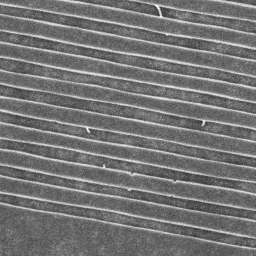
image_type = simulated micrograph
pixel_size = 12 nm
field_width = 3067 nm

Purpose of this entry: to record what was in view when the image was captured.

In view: parallel lines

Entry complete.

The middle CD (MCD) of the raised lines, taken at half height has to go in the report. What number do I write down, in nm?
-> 189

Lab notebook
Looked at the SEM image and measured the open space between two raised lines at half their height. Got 136 nm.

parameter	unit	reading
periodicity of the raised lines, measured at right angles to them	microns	0.318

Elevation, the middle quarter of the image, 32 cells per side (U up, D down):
UUUUUUUUUUUUUUUUDDDDDDDDDDDDDDDD
DUUUUUUUUUUUUUUUUUUUUUDDDDDDDDDD
DDDDDDDDUUUUUUUUUUUUUUUUUUUDDDDD
DDDDDDDDDDDDDUUUUUUUUUUUUUUUUUUU
UDDDDDDDDDDDDDDDDDDUUUUUUUUUUUUU
UUUUUUUUUDDDDDDDDDDDDDDDDDUUUUUU
UUUUUUUUUUUUUDDDDDDDDDDDDDDDDDDU
UUUUUUUUUUUUUUUUUUDDDDDDDDDDDDDD
DDDDUUUUUUUUUUUUUUUUUUUDDDDDDDDD
DDDDDDDDDDDUUUUUUUUUUUUUUUUUUUDD
DDDDDDDDDDDDDDDDUUUUUUUUUUUUUUUU
UUUUDDDDDDDDDDDDDDDDDDUUUUUUUUUU
UUUUUUUUUUDDDDDDDDDDDDDDDDUUUUUU
UUUUUUUUUUUUUUUDDDDDDDDDDDDDDDDD
UUUUUUUUUUUUUUUUUUUUUDDDDDDDDDDD
DDDUUUUUUUUUUUUUUUUUUUUUUDDDDDDD
DDDDDDDDDDUUUUUUUUUUUUUUUUUUUUUU
DDDDDDDDDDDDDDDDUUUUUUUUUUUUUUUU
UUUUUDDDDDDDDDDDDDDDDUUUUUUUUUUU
UUUUUUUUUDDDDDDDDDDDDDDDDDDUUUUU
UUUUUUUUUUUUUUUUDDDDDDDDDDDDDDDD
DDDUUUUUUUUUUUUUUUUUUUUDDDDDDDDD
DDDDDDDDUUUUUUUUUUUUUUUUUUUDDDDD
DDDDDDDDDDDDUUUUUUUUUUUUUUUUUUUU
UDDDDDDDDDDDDDDDDDDUUUUUUUUUUUUU
UUUUUUUUDDDDDDDDDDDDDDDUUUUUUUUU
UUUUUUUUUUUUUDDDDDDDDDDDDDDDDUUU
UUUUUUUUUUUUUUUUUUDDDDDDDDDDDDDD
DUUUUUUUUUUUUUUUUUUUUUUDDDDDDDDD
DDDDDDDUUUUUUUUUUUUUUUUUUUUUUUDD
DDDDDDDDDDDDUUUUUUUUUUUUUUUUUUUU
UUDDDDDDDDDDDDDDDDDUUUUUUUUUUUUU